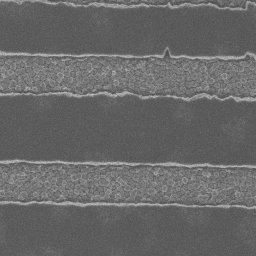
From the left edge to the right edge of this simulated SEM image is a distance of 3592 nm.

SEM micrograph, one or a few lines or trenches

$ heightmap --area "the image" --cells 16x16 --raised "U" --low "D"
UUUUUUUUUUUUUUUU
UUUUUUUUUUUUUUUU
UUUUUUUUUUUUUUUU
DDDDUDUUUUDUUUUU
DDDDDDDDDDDDDDDD
DDDDDDDDDDDDDDDD
UUUUUUUUUUUUUUUU
UUUUUUUUUUUUUUUU
UUUUUUUUUUUUUUUU
UUUUUUUUUUUUUUUU
DDDDDDDDDDDDDDDD
DDDDDDDDDDDDDDDD
DDDDDDDDDDDDDDDD
UUUUUUUUUUUUUUUU
UUUUUUUUUUUUUUUU
UUUUUUUUUUUUUUUU